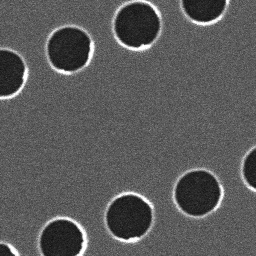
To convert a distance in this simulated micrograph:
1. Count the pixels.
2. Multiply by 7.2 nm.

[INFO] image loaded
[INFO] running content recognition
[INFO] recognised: holes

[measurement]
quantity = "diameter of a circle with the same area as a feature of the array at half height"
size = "45.2 pixels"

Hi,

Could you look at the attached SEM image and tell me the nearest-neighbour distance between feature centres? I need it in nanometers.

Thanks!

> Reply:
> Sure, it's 522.